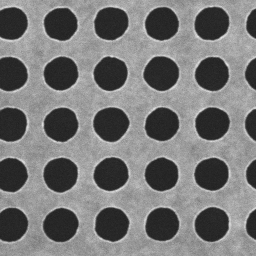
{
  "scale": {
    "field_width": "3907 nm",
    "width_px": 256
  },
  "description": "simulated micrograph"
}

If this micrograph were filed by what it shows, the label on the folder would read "a regular array of holes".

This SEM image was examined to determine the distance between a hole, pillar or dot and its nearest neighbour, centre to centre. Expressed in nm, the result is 761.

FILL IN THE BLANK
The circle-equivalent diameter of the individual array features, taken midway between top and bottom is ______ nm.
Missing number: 528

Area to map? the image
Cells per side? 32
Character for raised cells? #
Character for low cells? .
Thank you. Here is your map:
################################
...###...###....###...###...###.
...###....##....##....##.....##.
...###....##....##....##.....##.
...###...###...####...###...###.
################################
################################
..#####..####..####...###...####
...###....##....##....###....##.
...##.....##....##....##.....##.
...###...###...###....###...###.
################################
################################
#.#####.#####..#####.#####.#####
...###....##....###...###....##.
...##.....##....##....##.....##.
...###....##....##....###...###.
..#####..####..####..#####.#####
################################
################################
...###...###....###...###...###.
...##.....##....##....##.....##.
...###....##....##....##....###.
...###...###...####...###...####
################################
################################
...###...###...####...###...###.
....#.....##....##....##.....##.
....#.....##....##....##.....##.
...###...###....###...###...###.
################################
################################